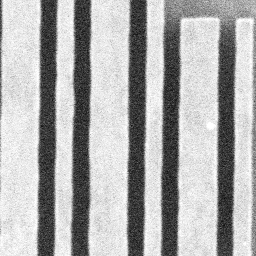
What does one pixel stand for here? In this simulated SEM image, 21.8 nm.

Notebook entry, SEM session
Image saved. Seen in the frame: groups of lines, slits or small figures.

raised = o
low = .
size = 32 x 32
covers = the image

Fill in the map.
ooooo..oo...oooo...o............
ooooo..oo..ooooo...o............
ooooo..oo...oooo...o...oooo...o.
ooooo..oo...oooo...o...oooo...o.
ooooo..oo..ooooo...o...oooo...o.
ooooo..oo..ooooo...o...oooo...o.
ooooo..oo..ooooo..oo...oooo...o.
ooooo..oo..ooooo..oo...oooo...o.
ooooo..oo..ooooo..oo...oooo..oo.
ooooo..oo...oooo..oo...oooo..oo.
ooooo..oo...oooo..oo...oooo..oo.
ooooo..oo..ooooo..oo...oooo..oo.
ooooo..oo..ooooo..oo...oooo..oo.
ooooo..oo..ooooo..oo...oooo..oo.
ooooo..oo..ooooo..oo...oooo..oo.
ooooo..oo..ooooo..oo...oooo..oo.
ooooo..oo..ooooo..oo...oooo..oo.
ooooo..oo..ooooo..oo...oooo..oo.
ooooo..oo..ooooo..oo...oooo..oo.
ooooo..oo..ooooo..oo...oooo..oo.
ooooo..oo..ooooo..oo..ooooo..oo.
ooooo..oo..ooooo..oo..ooooo..oo.
ooooo..oo..ooooo..oo..ooooo..oo.
ooooo..oo..ooooo..oo..ooooo..oo.
ooooo..oo..ooooo..oo..ooooo..oo.
ooooo..oo..ooooo..oo...oooo..oo.
ooooo..oo..ooooo..oo..ooooo..oo.
ooooo..oo..ooooo..oo..ooooo..oo.
ooooo..oo..ooooo..oo..ooooo..oo.
ooooo..oo..ooooo..oo..ooooo..oo.
ooooo..oo..ooooo..oo..ooooo..oo.
ooooo..oo..ooooo..oo..ooooo..oo.